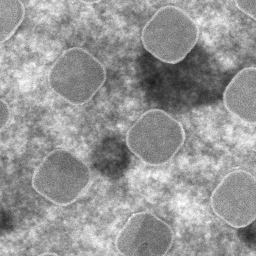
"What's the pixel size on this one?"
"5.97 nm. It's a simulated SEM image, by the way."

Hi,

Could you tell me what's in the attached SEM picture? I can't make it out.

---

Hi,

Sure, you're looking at raised bodies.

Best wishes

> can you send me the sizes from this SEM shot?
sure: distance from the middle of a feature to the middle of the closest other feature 604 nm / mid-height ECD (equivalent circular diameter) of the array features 322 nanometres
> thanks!